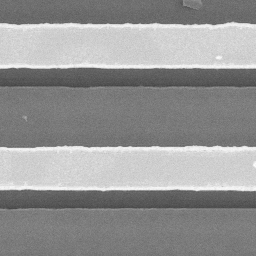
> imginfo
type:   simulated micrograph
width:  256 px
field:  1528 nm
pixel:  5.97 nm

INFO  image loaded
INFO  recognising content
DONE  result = lines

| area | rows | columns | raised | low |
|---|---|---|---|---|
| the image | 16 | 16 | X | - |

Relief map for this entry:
----------------
X-XXXX-XXX----XX
XXXXXXXXXXXXXXXX
XXXXXXXXXXXXXXXX
----------------
----------------
----------------
----------------
----------------
XXXXXXXXXXXXXXXX
XXXXXXXXXXXXXXXX
XXXXXXXXXXXXXXXX
----------------
----------------
----------------
----------------